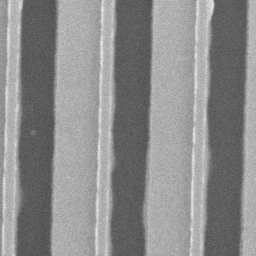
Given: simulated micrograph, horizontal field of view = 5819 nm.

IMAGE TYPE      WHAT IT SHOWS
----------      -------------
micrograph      lines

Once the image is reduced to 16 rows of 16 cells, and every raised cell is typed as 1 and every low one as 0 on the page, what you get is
1000111000111000
1000111000111000
1000111000111000
1000111000111000
1000111000111001
1000111000111001
1000111001111001
1000111001111001
1001111001111001
1001111001111001
1001111001111001
1001111001111001
1001111001111001
1001111001111001
1001111001111001
1001111001111001